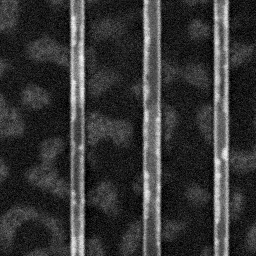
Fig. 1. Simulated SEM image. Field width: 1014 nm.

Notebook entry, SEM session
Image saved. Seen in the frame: one or a few lines or trenches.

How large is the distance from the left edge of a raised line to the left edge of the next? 285 nanometres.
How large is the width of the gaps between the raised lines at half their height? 230 nm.